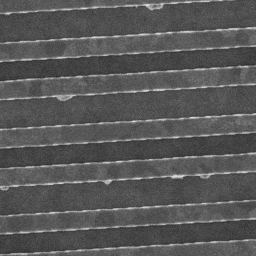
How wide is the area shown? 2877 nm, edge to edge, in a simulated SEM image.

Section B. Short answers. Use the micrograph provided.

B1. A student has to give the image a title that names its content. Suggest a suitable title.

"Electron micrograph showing lines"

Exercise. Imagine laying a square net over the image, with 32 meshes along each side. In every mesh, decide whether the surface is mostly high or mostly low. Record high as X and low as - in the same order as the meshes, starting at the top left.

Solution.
XXXXXXXXXXXXXXXXXXXXX-----------
XXXX----------------------------
--------------------------------
-------------------------------X
----------------XXXXXXXXXXXXXXXX
XXXXXXXXXXXXXXXXXXXXXXXXXXXXXXXX
XXXXXXXXXXXXXXXXXXXX------------
XX------------------------------
----------------------------XXXX
-----------XXXXXXXXXXXXXXXXXXXXX
XXXXXXXXXXXXXXXXXXXXXXXXXXXXXXXX
XXXXXXXXXXXXXXX-----------------
--------------------------------
--------------------------------
---------------------------XXXXX
----------XXXXXXXXXXXXXXXXXXXXXX
XXXXXXXXXXXXXXXXXXXXXXXXXXXXXXXX
XXXXXXXXXXXXXXXXX---------------
--------------------------------
-------------------------XXXXXXX
----------XXXXXXXXXXXXXXXXXXXXXX
XXXXXXXXXXXXXXXXXXXXXXXXXXXXXXX-
XXXXXXXXXXXXXX------------------
--------------------------------
--------------------------------
-------------------------XXXXXXX
--------XXXXXXXXXXXXXXXXXXXXXXXX
XXXXXXXXXXXXXXXXXXXXXXXXXXXXX---
XXXXXXXXXXXXXX------------------
--------------------------------
-----------------------XXXXXXXXX
------XXXXXXXXXXXXXXXXXXXXXXXXXX